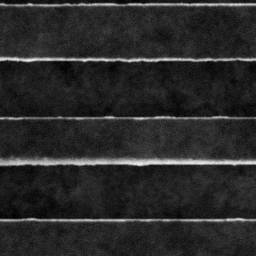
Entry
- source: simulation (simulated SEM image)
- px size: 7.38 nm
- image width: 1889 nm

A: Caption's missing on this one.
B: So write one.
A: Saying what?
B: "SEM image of lines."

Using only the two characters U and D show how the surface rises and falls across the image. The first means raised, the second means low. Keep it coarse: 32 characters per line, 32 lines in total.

DDDDDDDDDDDDDDDDDDDDDDDDDDDDDDDD
UUUUUUUUUUUUUUUUUUUUUUUUUUUUUUUU
UUUUUUUUUUUUUUUUUUUUUUUUUUUUUUUU
UUUUUUUUUUUUUUUUUUUUUUUUUUUUUUUU
UUUUUUUUUUUUUUUUUUUUUUUUUUUUUUUU
UUUUUUUUUUUUUUUUUUUUUUUUUUUUUUUU
UUUUUUUUUUUUUUUUUUUUUUUUUUUUUUUU
UUUUUUUUUUUUUUUUUUUUUUUUUUUUUDUU
DDDDDDDDDDDDDDDDDDDDDDDDDDDDDDDD
DDDDDDDDDDDDDDDDDDDDDDDDDDDDDDDD
DDDDDDDDDDDDDDDDDDDDDDDDDDDDDDDD
DDDDDDDDDDDDDDDDDDDDDDDDDDDDDDDD
DDDDDDDDDDDDDDDDDDDDDDDDDDDDDDDD
DDDDDDDDDDDDDDDDDDDDDDDDDDDDDDDD
DDDDDDDDDDDDDDDDDDDDDDDDDDDDDDDD
UUUUUUUUUUUUUUUUUUUUUUUUUUUUUUUU
UUUUUUUUUUUUUUUUUUUUUUUUUUUUUUUU
UUUUUUUUUUUUUUUUUUUUUUUUUUUUUUUU
UUUUUUUUUUUUUUUUUUUUUUUUUUUUUUUU
UUUUUUUUUUUUUUUUUUUUUUUUUUUUUUUU
DDDDDDDDDDDDDDDDDDDDDDDDDDDDDDDD
DDDDDDDDDDDDDDDDDDDDDDDDDDDDDDDD
DDDDDDDDDDDDDDDDDDDDDDDDDDDDDDDD
DDDDDDDDDDDDDDDDDDDDDDDDDDDDDDDD
DDDDDDDDDDDDDDDDDDDDDDDDDDDDDDDD
DDDDDDDDDDDDDDDDDDDDDDDDDDDDDDDD
DDDDDDDDDDDDDDDDDDDDDDDDDDDDDDDD
UUUUUUUUUUUUUUUUUUUUUUUUUUUUUUUU
UUUUUUUUUUUUUUUUUUUUUUUUUUUUUUUU
UUUUUUUUUUUUUUUUUUUUUUUUUUUUUUUU
UUUUUUUUUUUUUUUUUUUUUUUUUUUUUUUU
UUUUUUUUUUUUUUUUUUUUUUUUUUUUUUUU